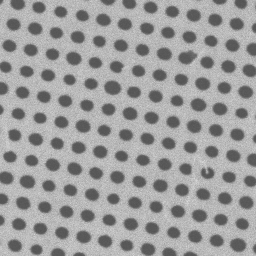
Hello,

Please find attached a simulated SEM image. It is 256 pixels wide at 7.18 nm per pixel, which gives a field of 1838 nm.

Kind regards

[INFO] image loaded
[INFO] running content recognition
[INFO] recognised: a regular array of holes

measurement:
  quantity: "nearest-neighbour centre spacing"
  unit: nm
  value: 154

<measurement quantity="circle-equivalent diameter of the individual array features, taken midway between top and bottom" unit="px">12.2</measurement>